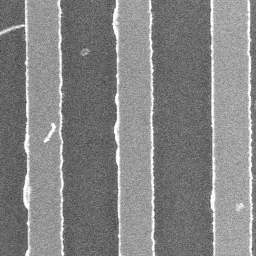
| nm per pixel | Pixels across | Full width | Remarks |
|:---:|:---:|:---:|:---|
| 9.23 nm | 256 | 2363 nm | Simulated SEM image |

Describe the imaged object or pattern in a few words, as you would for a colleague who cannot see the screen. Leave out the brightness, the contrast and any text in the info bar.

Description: lines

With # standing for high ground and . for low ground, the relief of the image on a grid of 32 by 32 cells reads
...####........####.......#####.
...#####......#####.......#####.
...####.......#####.......#####.
...####.......#####.......#####.
...#####.......####.......#####.
...#####.......####........####.
...#####.......####........####.
...#####.......####........####.
...#####.......####........####.
...#####.......####........####.
...#####.......####........####.
...#####.......####........####.
...#####.......####........####.
...#####.......####........####.
...#####.......####........####.
...#####......#####........####.
...#####......#####........####.
...#####.......####........####.
...#####.......####........####.
...#####.......####........####.
...#####.......####........####.
...#####.......####........####.
...#####.......####........####.
...#####.......####........####.
...#####.......####........####.
...#####.......####........####.
....####.......####........####.
...#####.......####........####.
...#####.......####........####.
....####.......####........####.
....####.......####........####.
...#####.......####........####.